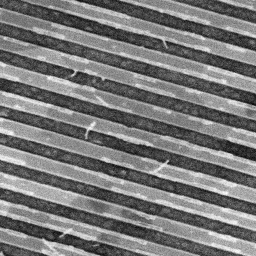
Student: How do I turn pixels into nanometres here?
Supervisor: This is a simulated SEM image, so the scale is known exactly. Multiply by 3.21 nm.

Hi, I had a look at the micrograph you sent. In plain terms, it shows parallel lines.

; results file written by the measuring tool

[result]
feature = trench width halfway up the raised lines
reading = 42.5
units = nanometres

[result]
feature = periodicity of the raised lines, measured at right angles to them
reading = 84.8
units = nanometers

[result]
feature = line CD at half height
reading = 0.0429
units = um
